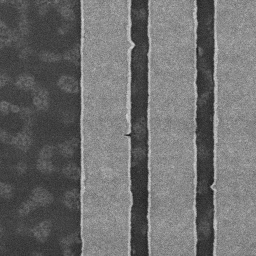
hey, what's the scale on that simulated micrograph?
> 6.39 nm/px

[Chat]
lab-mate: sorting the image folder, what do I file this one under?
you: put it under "one or a few lines or trenches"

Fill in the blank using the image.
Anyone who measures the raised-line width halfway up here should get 301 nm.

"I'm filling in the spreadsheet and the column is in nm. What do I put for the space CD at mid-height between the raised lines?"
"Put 124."